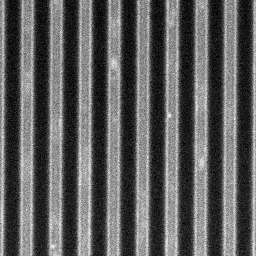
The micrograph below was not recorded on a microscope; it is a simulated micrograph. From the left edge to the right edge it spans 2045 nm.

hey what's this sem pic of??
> parallel lines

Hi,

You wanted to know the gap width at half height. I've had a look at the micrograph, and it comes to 0.0719 µm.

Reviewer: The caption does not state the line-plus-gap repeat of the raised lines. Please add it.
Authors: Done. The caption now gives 232 nanometers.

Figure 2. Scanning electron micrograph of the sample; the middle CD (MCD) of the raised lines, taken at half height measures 162 nanometers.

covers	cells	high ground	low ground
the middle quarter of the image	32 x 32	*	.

****...************..*****..****
****...****...*****..*****..****
****...****...*****..*****..****
****...****...*****..*****..****
****...****...*****..*****..****
****...****...*****..*****..****
****...****...*****..*****..****
****...****...*****..*****..****
****...****...*****..*****..****
****...****...****...*****..****
****...****...*****..*****..****
****...****...****...*****..****
****..*****...****...*****..****
****..*****...****...*****..****
****..*****...****...*****..****
****..*****...****...*****..****
****..*****...****...*****..****
****..*****...****...*****..****
****..*****...****...*****..****
****..*****...****...*****..****
****..*****...****...*****..****
****..*****...****...*****..****
****..*****...****...*****..****
****..*****...****...*****..****
****..*****...****...*****..****
****..*****...****...*****..****
****..*****...****...*****..****
****..*****...****...*****..****
****..*****...****...*****..****
****..*****...****...*****..****
****..*****...*****..*****..****
****..*****...*****..*****..****